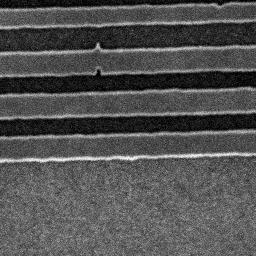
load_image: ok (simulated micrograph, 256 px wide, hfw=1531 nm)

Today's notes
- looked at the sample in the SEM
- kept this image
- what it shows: parallel lines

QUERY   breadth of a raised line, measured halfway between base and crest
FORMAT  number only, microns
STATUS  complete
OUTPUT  0.142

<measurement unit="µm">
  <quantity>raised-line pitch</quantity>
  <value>0.26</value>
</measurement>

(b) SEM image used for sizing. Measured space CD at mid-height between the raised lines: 110 nm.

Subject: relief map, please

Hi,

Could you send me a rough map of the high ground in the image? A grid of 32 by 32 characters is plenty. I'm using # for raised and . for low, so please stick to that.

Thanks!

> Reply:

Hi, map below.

........................#...####
################################
################################
##..............................
................................
................................
.....##.########################
################################
################################
####...#........................
................................
...............#################
################################
################################
###############.................
................................
..........................######
################################
################################
#########################.......
................................
................................
................................
................................
................................
................................
................................
................................
................................
................................
................................
................................